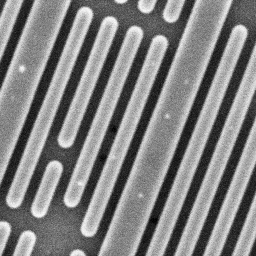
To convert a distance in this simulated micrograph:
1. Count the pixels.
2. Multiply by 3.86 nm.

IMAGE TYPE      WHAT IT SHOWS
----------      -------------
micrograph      groups of lines, slits or small figures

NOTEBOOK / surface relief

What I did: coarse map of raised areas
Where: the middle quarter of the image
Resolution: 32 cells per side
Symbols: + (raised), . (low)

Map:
++....++++...++++...++++...+++++
++...++++...++++...++++...++++++
++...++++...++++...++++...++++++
+...++++....+++....++++...++++++
+...++++...++++...++++...+++++++
....++++...++++...++++...+++++++
...++++....+++...++++....+++++++
...++++...++++...++++...++++++++
...++++...++++...++++...++++++++
..++++...++++...++++...+++++++++
..++++...++++...++++...+++++++++
.++++....++++...++++...++++++++.
.++++...++++...++++...+++++++++.
.++++...++++...++++...+++++++++.
++++...++++...++++...+++++++++..
++++...++++...++++...+++++++++..
++++...++++...++++...+++++++++..
+++...++++...++++...+++++++++...
+++...++++...++++...+++++++++...
++...+++++...+++....++++++++...+
++...++++...++++...+++++++++...+
.....++++...++++...+++++++++...+
....++++...++++...+++++++++...++
....++++...++++...+++++++++...++
...+++++...+++....++++++++...+++
...++++...++++...+++++++++...+++
...++++...++++...+++++++++...+++
..++++...++++...+++++++++...++++
..++++...++++...+++++++++...++++
..++++...++++...++++++++...+++++
.++++...++++...+++++++++...++++.
.++++...++++...+++++++++...++++.